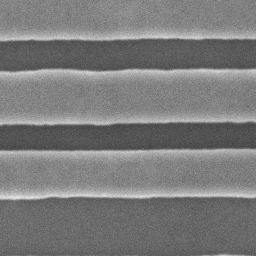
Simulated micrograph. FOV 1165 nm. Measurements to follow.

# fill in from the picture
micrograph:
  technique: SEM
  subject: lines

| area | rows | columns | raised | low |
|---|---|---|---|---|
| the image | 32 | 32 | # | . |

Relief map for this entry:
################################
################################
################################
################################
################################
................................
................................
................................
................................
################################
################################
################################
################################
################################
################################
#..####..#####..................
................................
................................
................................
################################
################################
################################
################################
################################
##########################...###
................................
................................
................................
................................
................................
................................
................................